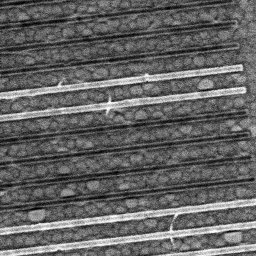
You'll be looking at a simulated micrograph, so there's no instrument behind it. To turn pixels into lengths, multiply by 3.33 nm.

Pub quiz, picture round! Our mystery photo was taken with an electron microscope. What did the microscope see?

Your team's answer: parallel lines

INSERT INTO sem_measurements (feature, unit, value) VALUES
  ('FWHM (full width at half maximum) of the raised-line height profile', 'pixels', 5.47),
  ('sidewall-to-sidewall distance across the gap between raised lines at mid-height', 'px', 17.1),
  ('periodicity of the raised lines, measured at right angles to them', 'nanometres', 74.7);